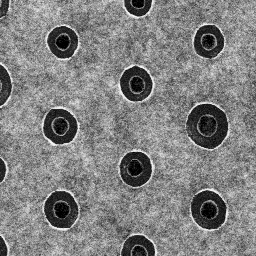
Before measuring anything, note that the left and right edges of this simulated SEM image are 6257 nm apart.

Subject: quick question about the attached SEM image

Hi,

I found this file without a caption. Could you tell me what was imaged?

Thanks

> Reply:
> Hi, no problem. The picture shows a regular array of ring-shaped raised bodies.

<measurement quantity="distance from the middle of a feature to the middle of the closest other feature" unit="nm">2030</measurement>